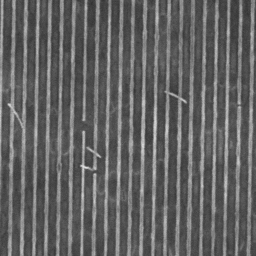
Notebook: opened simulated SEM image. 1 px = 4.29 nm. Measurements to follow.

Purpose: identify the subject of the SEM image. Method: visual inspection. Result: parallel lines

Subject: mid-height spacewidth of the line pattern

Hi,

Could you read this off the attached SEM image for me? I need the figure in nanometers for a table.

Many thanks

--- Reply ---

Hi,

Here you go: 40.2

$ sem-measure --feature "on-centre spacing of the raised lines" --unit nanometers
51.2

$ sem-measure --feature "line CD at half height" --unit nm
12.3